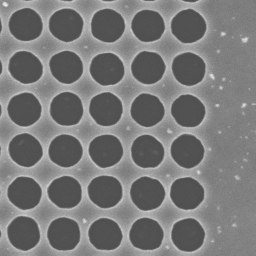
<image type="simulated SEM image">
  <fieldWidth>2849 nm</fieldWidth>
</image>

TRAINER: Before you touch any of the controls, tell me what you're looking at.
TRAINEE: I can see a regular array of holes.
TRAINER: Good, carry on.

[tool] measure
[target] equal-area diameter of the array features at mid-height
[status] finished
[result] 0.376 um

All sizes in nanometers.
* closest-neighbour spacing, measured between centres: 447